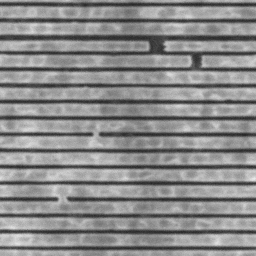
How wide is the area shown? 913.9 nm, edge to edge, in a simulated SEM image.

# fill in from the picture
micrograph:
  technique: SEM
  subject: parallel lines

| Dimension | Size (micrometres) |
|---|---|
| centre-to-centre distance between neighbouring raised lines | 0.0581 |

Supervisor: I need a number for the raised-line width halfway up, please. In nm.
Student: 39.3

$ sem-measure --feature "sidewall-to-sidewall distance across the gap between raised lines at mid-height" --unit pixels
5.01